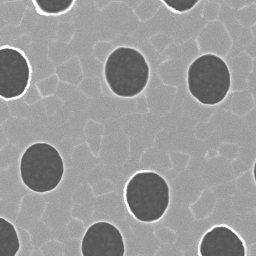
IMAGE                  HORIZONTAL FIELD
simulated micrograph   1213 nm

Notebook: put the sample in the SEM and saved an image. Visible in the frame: holes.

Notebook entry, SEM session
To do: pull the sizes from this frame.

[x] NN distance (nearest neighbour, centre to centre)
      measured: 456 nm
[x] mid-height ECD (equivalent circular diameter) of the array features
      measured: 0.217 µm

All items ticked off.